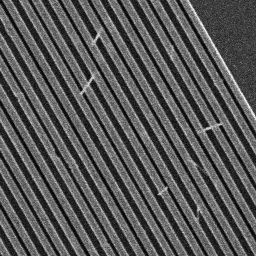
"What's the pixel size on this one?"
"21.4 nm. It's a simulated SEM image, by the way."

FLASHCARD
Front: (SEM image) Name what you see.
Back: parallel lines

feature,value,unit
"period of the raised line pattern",273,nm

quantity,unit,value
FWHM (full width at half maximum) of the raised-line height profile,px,7.37